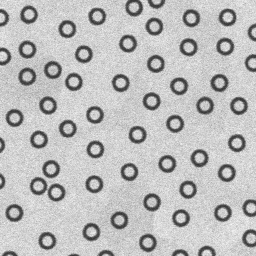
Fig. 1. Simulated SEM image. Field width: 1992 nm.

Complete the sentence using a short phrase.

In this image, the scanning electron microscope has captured a regular array of ring-shaped grooves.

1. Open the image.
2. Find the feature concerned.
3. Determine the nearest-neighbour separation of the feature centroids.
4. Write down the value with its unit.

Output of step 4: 238 nanometres